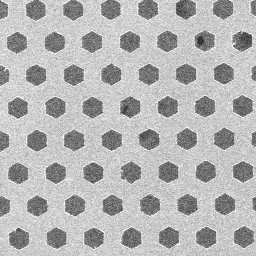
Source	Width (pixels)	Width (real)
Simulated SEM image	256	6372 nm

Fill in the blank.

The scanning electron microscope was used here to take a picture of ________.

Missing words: a regular array of holes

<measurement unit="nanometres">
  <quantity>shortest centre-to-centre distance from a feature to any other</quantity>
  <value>931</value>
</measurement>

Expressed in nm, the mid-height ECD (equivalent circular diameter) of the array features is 532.